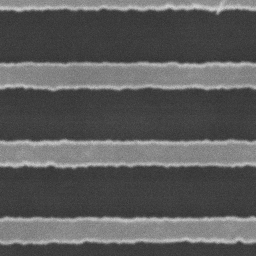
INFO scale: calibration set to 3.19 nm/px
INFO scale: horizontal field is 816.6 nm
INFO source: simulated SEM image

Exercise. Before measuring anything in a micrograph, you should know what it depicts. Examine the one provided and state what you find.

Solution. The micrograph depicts lines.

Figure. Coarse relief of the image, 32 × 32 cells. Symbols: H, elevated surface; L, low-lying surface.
HHHHHHHHHHHHHHHHHHHHHHHHHHHHHHHH
LLLLLLLLLLLLLLLLLLLLLLLLLLLLLLLL
LLLLLLLLLLLLLLLLLLLLLLLLLLLLLLLL
LLLLLLLLLLLLLLLLLLLLLLLLLLLLLLLL
LLLLLLLLLLLLLLLLLLLLLLLLLLLLLLLL
LLLLLLLLLLLLLLLLLLLLLLLLLLLLLLLL
LLLLLLLLLLLLLLLLLLLLLLLLLLLLLLLL
LLLLLLLLLLLLLLLLLLLLLLLLLLLLLLLL
HHHHHHHHHHHHHHHHHHHHHHHHHHHHHHHH
HHHHHHHHHHHHHHHHHHHHHHHHHHHHHHHH
HHHHHHHHHHHHHHHHHHHHHHHHHHHHHHHH
LLLLLLLLLLLLLLLLLLLLLLLLLLLLLLLL
LLLLLLLLLLLLLLLLLLLLLLLLLLLLLLLL
LLLLLLLLLLLLLLLLLLLLLLLLLLLLLLLL
LLLLLLLLLLLLLLLLLLLLLLLLLLLLLLLL
LLLLLLLLLLLLLLLLLLLLLLLLLLLLLLLL
LLLLLLLLLLLLLLLLLLLLLLLLLLLLLLLL
LLLLLLLLLLLLLLLLLLLLLLLLLLLLLLLL
HHHHHHHHHHHHHHHHHHHHHHHHHHHHHHHH
HHHHHHHHHHHHHHHHHHHHHHHHHHHHHHHH
HHHHHHHHHHHHHHHHHHHHHHHHHHHHHHHH
LLLLLLLLLLLLLLLLLLLLLLLLLLLLLLLL
LLLLLLLLLLLLLLLLLLLLLLLLLLLLLLLL
LLLLLLLLLLLLLLLLLLLLLLLLLLLLLLLL
LLLLLLLLLLLLLLLLLLLLLLLLLLLLLLLL
LLLLLLLLLLLLLLLLLLLLLLLLLLLLLLLL
LLLLLLLLLLLLLLLLLLLLLLLLLLLLLLLL
HHHHHHHHHHHHHHHHHHHHHHHHHHHHHHHH
HHHHHHHHHHHHHHHHHHHHHHHHHHHHHHHH
HHHHHHHHHHHHHHHHHHHHHHHHHHHHHHHH
LLLLLLLLLLLLLLLLLLLLLLLLLLLLLLLL
LLLLLLLLLLLLLLLLLLLLLLLLLLLLLLLL